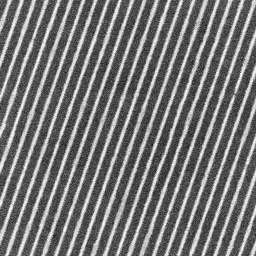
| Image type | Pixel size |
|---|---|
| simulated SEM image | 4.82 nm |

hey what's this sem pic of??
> parallel lines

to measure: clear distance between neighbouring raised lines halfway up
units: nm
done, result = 46.1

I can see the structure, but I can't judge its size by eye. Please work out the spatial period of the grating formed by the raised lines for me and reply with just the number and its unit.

55.8 nanometres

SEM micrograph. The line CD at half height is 12.6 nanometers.